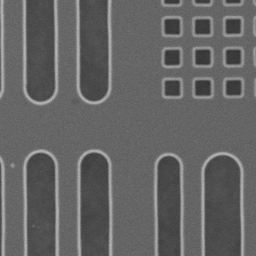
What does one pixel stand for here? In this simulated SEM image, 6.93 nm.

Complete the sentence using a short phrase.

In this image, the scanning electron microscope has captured groups of lines, slits or small figures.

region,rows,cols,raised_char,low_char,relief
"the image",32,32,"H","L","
HHHLLLLHHHLLLLHHHHHHHLHHHLHHHLHH
HHHLLLLHHHLLLLHHHHHHHHHHHHHHHHHH
HHHLLLLHHHLLLLHHHHHHHLHHLLHHLLHH
HHHLLLLHHHLLLLHHHHHHLLLHLLHHLLHH
HHHLLLLHHHLLLLHHHHHHHHHHHHHHHHHH
HHHLLLLHHHLLLLHHHHHHHHHHHHHHHHHH
HHHLLLLHHHLLLLHHHHHHLLHHLLHHLLHH
HHHLLLLHHHLLLLHHHHHHLLLHLLHHLLHH
HHHLLLLHHHLLLLHHHHHHHHHHHHHHHHHH
HHHLLLLHHHLLLLHHHHHHHHHHHHHHHHHH
HHHLLLLHHHLLLLHHHHHHLLLHLLHHLLHH
HHHLLLLHHHLLLLHHHHHHLLLHLLHHLLHH
HHHHLLHHHHHLLHHHHHHHHHHHHHHHHHHH
HHHHHHHHHHHHHHHHHHHHHHHHHHHHHHHH
HHHHHHHHHHHHHHHHHHHHHHHHHHHHHHHH
HHHHHHHHHHHHHHHHHHHHHHHHHHHHHHHH
HHHHHHHHHHHHHHHHHHHHHHHHHHHHHHHH
HHHHHHHHHHHHHHHHHHHHHHHHHHHHHHHH
HHHHHHHHHHHHHHHHHHHHHHHHHHHHHHHH
HHHHLLHHHHLLLHHHHHHHLLHHHHHLLHHH
HHHLLLLHHHLLLLHHHHHHLLLHHHLLLLHH
HHHLLLLHHHLLLLHHHHHLLLLHHLLLLLHH
HHHLLLLHHHLLLLHHHHHLLLLHHLLLLLHH
HHHLLLLHHHLLLLHHHHHLLLLHHLLLLLHH
HHHLLLLHHHLLLLHHHHHLLLLHHLLLLLHH
HHHLLLLHHHLLLLHHHHHLLLLHHLLLLLHH
HHHLLLLHHHLLLLHHHHHLLLLHHLLLLLHH
HHHLLLLHHHLLLLHHHHHHLLLHHLLLLLHH
HHHLLLLHHHLLLLHHHHHHLLLHHLLLLLHH
HHHLLLLHHHLLLLHHHHHHLLLHHLLLLLHH
HHHLLLLHHHLLLLHHHHHHLLLHHLLLLLHH
HHHLLLLHHHLLLLHHHHHHLLLHHLLLLLHH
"